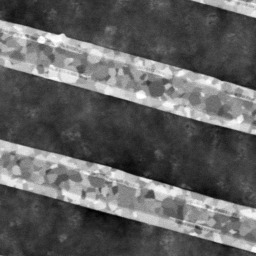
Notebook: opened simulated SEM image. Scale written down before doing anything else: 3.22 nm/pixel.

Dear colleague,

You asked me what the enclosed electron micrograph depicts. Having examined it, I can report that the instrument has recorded one or a few lines or trenches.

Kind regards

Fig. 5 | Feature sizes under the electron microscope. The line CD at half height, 110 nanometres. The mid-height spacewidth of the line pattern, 259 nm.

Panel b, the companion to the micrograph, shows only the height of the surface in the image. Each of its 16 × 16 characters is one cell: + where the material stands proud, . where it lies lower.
...............+
................
++++............
+++++++.........
...++++++++.....
......++++++++..
..........++++++
..............++
................
++..............
++++++..........
.++++++++.......
.....++++++++...
.........+++++++
............++++
................